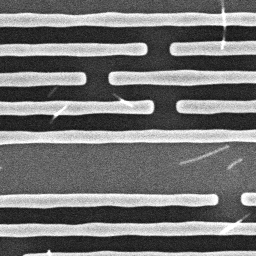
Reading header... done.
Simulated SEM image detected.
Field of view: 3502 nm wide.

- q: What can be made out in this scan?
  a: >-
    groups of lines, slits or small figures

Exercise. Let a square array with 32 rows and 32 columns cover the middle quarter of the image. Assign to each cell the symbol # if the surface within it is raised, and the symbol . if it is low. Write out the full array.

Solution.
................................
................................
#####......#####################
#####......#####################
#####......#####################
................................
................................
................................
................................
###.........##########.......###
######################......####
######################......####
#####...........................
................................
................................
................................
................................
################################
################################
###.######......................
................................
................................
................................
................................
................................
................................
................................
................................
................................
................................
................................
................................